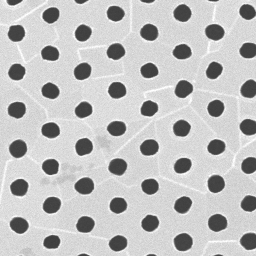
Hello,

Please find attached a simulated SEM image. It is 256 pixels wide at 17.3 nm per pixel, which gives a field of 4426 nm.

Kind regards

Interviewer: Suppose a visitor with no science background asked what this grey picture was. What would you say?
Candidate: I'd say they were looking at a regular array of holes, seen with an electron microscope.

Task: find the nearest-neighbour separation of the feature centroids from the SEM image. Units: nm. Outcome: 641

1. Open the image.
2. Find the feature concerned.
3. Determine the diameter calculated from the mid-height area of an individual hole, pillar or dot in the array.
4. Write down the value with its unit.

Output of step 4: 17.2 px